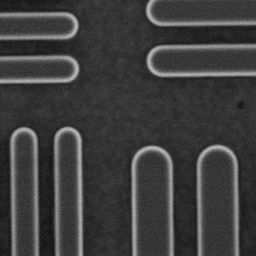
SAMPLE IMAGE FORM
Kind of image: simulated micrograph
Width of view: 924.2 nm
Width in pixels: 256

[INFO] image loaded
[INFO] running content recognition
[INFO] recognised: groups of lines, slits or small figures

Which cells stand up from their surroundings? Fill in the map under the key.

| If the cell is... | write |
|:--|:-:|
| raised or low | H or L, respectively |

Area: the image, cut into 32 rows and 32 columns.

LLLLLLLLLLLLLLLLLLLHHHHHHHHHHHHH
LLLLLLLLLLLLLLLLLLHHHHHHHHHHHHHH
HHHHHHHHHLLLLLLLLLLHHHHHHHHHHHHH
HHHHHHHHHHLLLLLLLLLLLLLLLLLLLLLL
HHHHHHHHHLLLLLLLLLLLLLLLLLLLLLLL
LLLLLLLLLLLLLLLLLLLLLLLLLLLLLLLL
LLLLLLLLLLLLLLLLLLLHHHHHHHHHHHHH
HHHHHHHHHLLLLLLLLLLHHHHHHHHHHHHH
HHHHHHHHHHLLLLLLLLLHHHHHHHHHHHHH
HHHHHHHHHLLLLLLLLLLLLLLLLLLLLLLL
LLLLLLLLLLLLLLLLLLLLLLLLLLLLLLLL
LLLLLLLLLLLLLLLLLLLLLLLLLLLLLLLL
LLLLLLLLLLLLLLLLLLLLLLLLLLLLLLLL
LLLLLLLLLLLLLLLLLLLLLLLLLLLLLLLL
LLLLLLLLLLLLLLLLLLLLLLLLLLLLLLLL
LLLLLLLLLLLLLLLLLLLLLLLLLLLLLLLL
LLHHLLLHHLLLLLLLLLLLLLLLLLLLLLLL
LLHHHLLHHHLLLLLLLLLLLLLLLLLLLLLL
LLHHHLLHHHLLLLLLLLHHLLLLLLHHLLLL
LLHHHLLHHHLLLLLLLHHHHLLLLHHHHLLL
LLHHHLLHHHLLLLLLLHHHHLLLLHHHHLLL
LLHHHLLHHHLLLLLLLHHHHLLLLHHHHHLL
LLHHHLLHHHLLLLLLLHHHHLLLLHHHHHLL
LLHHHLLHHHLLLLLLLHHHHLLLLHHHHHLL
LLHHHLLHHHLLLLLLLHHHHLLLLHHHHHLL
LLHHHLLHHHLLLLLLLHHHHLLLLHHHHHLL
LLHHHLLHHHLLLLLLLHHHHLLLLHHHHHLL
LLHHHLLHHHLLLLLLLHHHHLLLLHHHHHLL
LLHHHLLHHHLLLLLLLHHHHLLLLHHHHHLL
LLHHHLLHHHLLLLLLLHHHHLLLLHHHHHLL
LLHHHLLHHHLLLLLLLHHHHLLLLHHHHHLL
LLHHHLLHHHLLLLLLLHHHHLLLLHHHHHLL